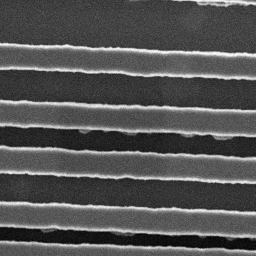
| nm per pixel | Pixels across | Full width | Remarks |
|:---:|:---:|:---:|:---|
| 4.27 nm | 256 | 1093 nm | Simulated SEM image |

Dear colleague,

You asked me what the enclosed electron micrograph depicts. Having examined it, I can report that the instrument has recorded lines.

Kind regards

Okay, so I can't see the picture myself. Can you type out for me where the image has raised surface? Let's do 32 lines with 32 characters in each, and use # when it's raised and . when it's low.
...............................#
................................
................................
................................
................................
................................
#######################.........
################################
################################
..................##############
................................
................................
................................
########################........
################################
################################
...............#################
................................
##..............................
############################....
################################
################################
.......................#########
................................
................................
####............................
#############################...
################################
...#############################
...........................#####
########........................
################################